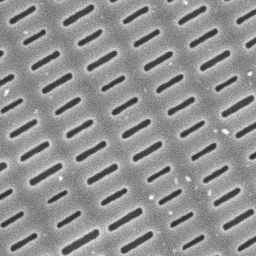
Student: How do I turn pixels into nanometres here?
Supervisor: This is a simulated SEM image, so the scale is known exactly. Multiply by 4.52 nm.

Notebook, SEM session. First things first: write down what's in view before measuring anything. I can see a regular array of holes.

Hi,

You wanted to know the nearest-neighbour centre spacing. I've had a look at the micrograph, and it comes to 114 nanometres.